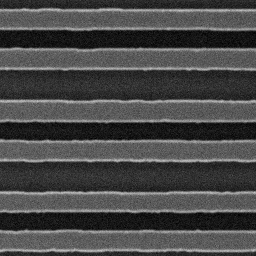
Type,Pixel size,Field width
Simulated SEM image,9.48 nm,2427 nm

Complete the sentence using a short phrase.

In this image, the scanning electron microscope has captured lines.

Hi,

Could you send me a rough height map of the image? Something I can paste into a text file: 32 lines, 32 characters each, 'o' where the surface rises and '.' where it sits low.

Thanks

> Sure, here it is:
................................
oooooooooooooooooooooooooooooooo
oooooooooooooooooooooooooooooooo
oooooooooooooooooooooooooooooooo
................................
................................
oooooooooooooooooooooooooooooooo
oooooooooooooooooooooooooooooooo
oooooooooooooooooooooooooooooooo
................................
................................
................................
................................
oooooooooooooooooooooooooooooooo
oooooooooooooooooooooooooooooooo
................................
................................
o...............................
oooooooooooooooooooooooooooooooo
oooooooooooooooooooooooooooooooo
................................
................................
................................
................................
oooooooooooooooooooooooooooooooo
oooooooooooooooooooooooooooooooo
.ooo............o..o.oooo.o.....
................................
................................
oooooooooooooooooooooooooooooooo
oooooooooooooooooooooooooooooooo
................................